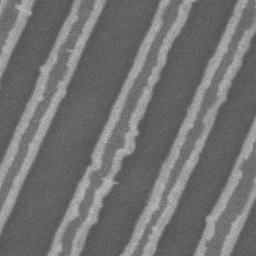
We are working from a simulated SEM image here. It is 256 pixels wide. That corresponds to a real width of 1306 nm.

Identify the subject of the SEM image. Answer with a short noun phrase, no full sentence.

one or a few lines or trenches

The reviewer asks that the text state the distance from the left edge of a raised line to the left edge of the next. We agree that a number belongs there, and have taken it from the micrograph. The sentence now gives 372 nanometres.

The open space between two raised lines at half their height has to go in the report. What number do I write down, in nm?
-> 235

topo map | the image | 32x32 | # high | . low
####......###.......###.......##
###......###........###.......##
###......###........###......###
##......###........###.......###
##......###........###......###.
#......###........###.......###.
#......###........###......###..
......###........###.......###..
......###........###......###...
.....###........###.......###...
.....###........###.......##....
.....###........###......###....
....###........###.......###....
....###........###......###.....
...###........###.......##......
...###........###......###......
..###........####......###......
..###........###......###......#
.###........####......###......#
.###........###.......##......##
.###........###......###......##
###........###.......##......###
###........###......###......###
##........###.......###......###
##........###......###......####
#........###.......###......###.
#........###......###......####.
........###.......###.....####..
........###......###......####..
.......###.......###......###...
.......###.......##......####...
.......###......###......###....